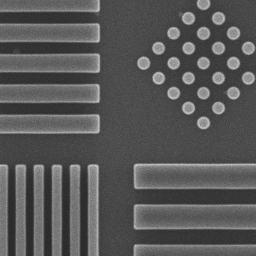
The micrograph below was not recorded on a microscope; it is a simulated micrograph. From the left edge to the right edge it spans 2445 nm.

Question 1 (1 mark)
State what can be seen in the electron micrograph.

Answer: groups of lines, slits or small figures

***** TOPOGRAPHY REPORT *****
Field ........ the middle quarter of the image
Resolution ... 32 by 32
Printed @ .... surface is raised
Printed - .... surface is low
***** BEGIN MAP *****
@@@@@@@@@----------@@-----@@@---
@@@@@@@@@-----------------------
-----------------------@@-----@@
----------------------@@@-----@@
-----------------------@@-----@@
@@@@@@@@------------------------
@@@@@@@@@-----------------@@@---
@@@@@@@@@-----------------@@@---
@@@@@@@@@------------------@----
@@@@@@@@------------------------
------------------------------@@
------------------------------@@
--------------------------------
@@@@@@@@@-----------------------
@@@@@@@@@-----------------------
@@@@@@@@@-----------------------
@@@@@@@@@-----------------------
--------------------------------
--------------------------------
--------------------------------
--------------------------------
--------------------------------
--------------------------------
--------------------------------
--------------------------------
--@@--@@----------@@@@@@@@@@@@@@
--@@--@@----------@@@@@@@@@@@@@@
--@@--@@----------@@@@@@@@@@@@@@
--@@--@@----------@@@@@@@@@@@@@@
--@@--@@----------@@@@@@@@@@@@@@
--@@--@@----------@@@@@@@@@@@@@@
--@@--@@------------------------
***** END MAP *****